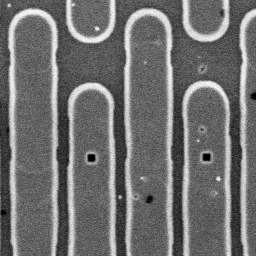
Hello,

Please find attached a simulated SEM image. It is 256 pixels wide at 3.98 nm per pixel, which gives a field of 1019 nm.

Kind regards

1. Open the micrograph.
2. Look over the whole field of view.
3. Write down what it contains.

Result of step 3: wiring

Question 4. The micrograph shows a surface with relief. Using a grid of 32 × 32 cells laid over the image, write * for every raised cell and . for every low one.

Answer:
........******.........*****....
...**...******....*....*****....
..****...*****..*****..*****...*
.******..*****..*****..*****..**
.******..****...*****...***...**
.******.........*****.........**
.******.........*****.........**
.******.........*****..........*
.******.........*****.........**
.******.........*****.........**
.******.........*****....*....**
.******..****...*****...****..**
.******..*****..*****..*****..**
.******..*****..*****..*****..**
.******..*****..*****..*****..**
.******..*****..*****..*****..**
.******..*****..*****..*****..**
.******..*****..*****..******.**
.******..*****..*****..******.**
..*****..**.**..*****..******.**
.******..*****..*****..******.**
.******..*****..*****..*****..**
.******..*****..*****..*****..**
.******..*****..*****..******.**
..*****..*****..*****..******.**
..*****..*****..*****..******.**
..*****..*****..*****..******.**
..*****..*****..*****..*****..**
..*****..*****..*****..*****..**
..*****..*****..*****..*****..**
..*****..*****..*****..******..*
..*****..*****..*****..******..*